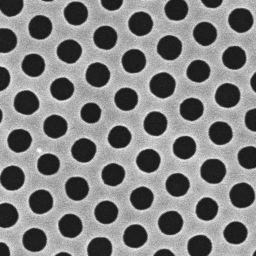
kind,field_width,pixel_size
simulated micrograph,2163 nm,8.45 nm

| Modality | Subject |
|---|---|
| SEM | a regular array of holes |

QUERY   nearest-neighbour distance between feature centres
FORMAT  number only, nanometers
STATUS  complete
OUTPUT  316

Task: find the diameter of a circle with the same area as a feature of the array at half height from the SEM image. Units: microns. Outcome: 0.209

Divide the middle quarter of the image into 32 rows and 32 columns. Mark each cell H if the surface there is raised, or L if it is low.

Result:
HHHHHHLLLLHHHHHLLLLLHHHHHHHHHHHL
HHHHHHLLLLLHHHHLLLLLHHHHHHHHHHHL
HHHHHLLLLLLLHHHHHHHHHHHLLLHHHHHL
LHHHHLLLLLLLHHHHHHHHHHLLLLLHHHHL
LLHHHHLLLLLHHHHHHHHHHLLLLLLLHHHH
LLLHHHHLLLHHHHHHHHHHHLLLLLLLHHHH
LLLHHHHHHHHHHLLLLLHHHLLLLLLLHHHH
LLHHHHHHHHHHHLLLLLHHHHLLLLLHHHHH
LLHHHHHHHHHHLLLLLLLHHHHHLLHHHHHL
HHHHHHHHHHHHHLLLLLHHHHHHHHHHHHLL
HHHHHLLLLHHHHLLLLLHHHHHHHHHHHLLL
HHHHLLLLLHHHHHLLLHHHHHHHHHHHHLLL
HHHHLLLLLHHHHHHHHHHHHLLLLHHHHLLL
HHHHLLLLLHHHHHHHHHHHLLLLLLHHHHLL
LHHHHLLLHHHHHHHHHHHHLLLLLLHHHHHH
LHHHHHHHHHHHHLLHHHHHLLLLLLHHHHHH
LHHHHHHHHHHHLLLLHHHHLLLLLHHHHHHH
HHHHHHHHHHHLLLLLLHHHHLLLLHHHHHHH
HHHHHHHHHHHLLLLLLHHHHHHHHHHHLLLL
HHHLLLLHHHHLLLLLLHHHHHHHHHHLLLLL
HHLLLLLLHHHHLLLLHHHHHHHHHHHLLLLL
HHLLLLLLHHHHHHHHHHHHLLLHHHHLLLLL
HHLLLLLLHHHHHHHHHHHLLLLLHHHLLLLL
HHLLLLLHHHHHHHHHHHLLLLLLHHHHHLLH
HHHHLLHHHHHHHHHHHHLLLLLLHHHHHHHH
HHHHHHHHHHLLLLHHHHLLLLLLHHHHHHHH
HHHHHHHHHHLLLLLHHHHLLLLHHHHHHHHH
HHHHHHHHHLLLLLLHHHHHHHHHHHHLLLHH
HLLLLHHHHLLLLLLHHHHHHHHHHHLLLLLH
LLLLLLHHHHLLLLLHHHHHHHHHHLLLLLLH
LLLLLLHHHHHLLHHHHHHLHHHHHLLLLLLL
LLLLLLHHHHHHHHHHHLLLLLHHHHLLLLLH